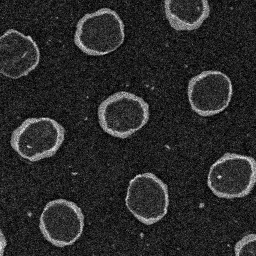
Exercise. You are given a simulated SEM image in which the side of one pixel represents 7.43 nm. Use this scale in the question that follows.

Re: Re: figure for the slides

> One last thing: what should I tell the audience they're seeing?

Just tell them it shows raised bodies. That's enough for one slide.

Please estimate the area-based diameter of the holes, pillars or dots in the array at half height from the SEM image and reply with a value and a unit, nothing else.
43.3 pixels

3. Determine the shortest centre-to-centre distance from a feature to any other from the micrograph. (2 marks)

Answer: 87.4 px